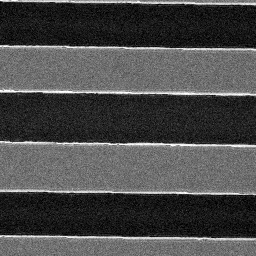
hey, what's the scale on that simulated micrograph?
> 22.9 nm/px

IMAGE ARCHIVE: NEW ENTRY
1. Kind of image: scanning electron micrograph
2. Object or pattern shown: lines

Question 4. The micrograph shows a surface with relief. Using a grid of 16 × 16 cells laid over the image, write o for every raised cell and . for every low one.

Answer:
................
................
................
oooooooooooooooo
oooooooooooooooo
oooooooooooooooo
................
................
................
oooooooooooooooo
oooooooooooooooo
oooooooooooooooo
................
................
................
oooooooooooooooo